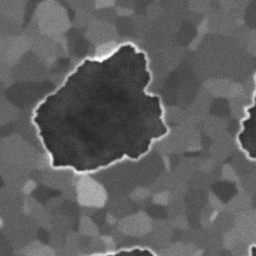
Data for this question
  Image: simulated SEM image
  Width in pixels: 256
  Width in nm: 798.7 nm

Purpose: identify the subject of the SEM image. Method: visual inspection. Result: holes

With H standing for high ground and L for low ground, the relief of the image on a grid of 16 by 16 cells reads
HHHHHHHHHHHHHHHH
HHHHHHHHHHHHHHHH
HHHHHHHHHHHHHHHH
HHHHHHHLLHHHHHHH
HHHHHLLLLHHHHHHH
HHHHLLLLLHHHHHHH
HHHLLLLLLLHHHHHH
HHLLLLLLLLHHHHHL
HHHLLLLLLLHHHHHL
HHHLLLLLLHHHHHHL
HHHHLLHHHHHHHHHH
HHHHHHHHHHHHHHHH
HHHHHHHHHHHHHHHH
HHHHHHHHHHHHHHHH
HHHHHHHHHHHHHHHH
HHHHHHHHHHHHHHHH